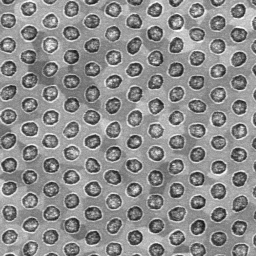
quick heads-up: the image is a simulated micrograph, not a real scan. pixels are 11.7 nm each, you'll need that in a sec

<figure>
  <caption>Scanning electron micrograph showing a regular array of holes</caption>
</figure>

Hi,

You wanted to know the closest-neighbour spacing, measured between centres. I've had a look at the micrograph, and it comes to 276 nanometres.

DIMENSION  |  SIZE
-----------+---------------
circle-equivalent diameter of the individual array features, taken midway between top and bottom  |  16 px